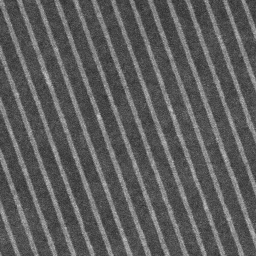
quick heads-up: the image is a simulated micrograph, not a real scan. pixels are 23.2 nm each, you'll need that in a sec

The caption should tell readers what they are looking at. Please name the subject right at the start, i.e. parallel lines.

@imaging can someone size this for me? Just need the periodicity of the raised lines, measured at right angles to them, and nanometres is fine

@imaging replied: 407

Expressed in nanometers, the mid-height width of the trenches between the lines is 335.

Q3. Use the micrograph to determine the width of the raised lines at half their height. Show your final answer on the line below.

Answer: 0.0763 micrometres